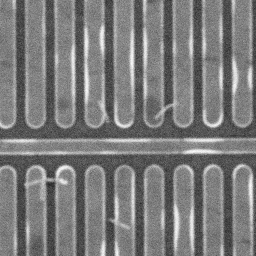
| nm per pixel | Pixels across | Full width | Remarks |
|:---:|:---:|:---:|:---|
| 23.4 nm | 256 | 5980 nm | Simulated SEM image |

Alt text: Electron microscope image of groups of lines, slits or small figures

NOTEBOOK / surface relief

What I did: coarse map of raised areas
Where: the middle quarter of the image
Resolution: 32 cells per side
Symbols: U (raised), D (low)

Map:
UUDDDDUUUUDDDUUUUDDDUUUUDDDDUUUU
UUDDDDUUUUDDDUUUUDDDUUUUDDDDUUUU
UUDDDDUUUUDDDUUUUDDDUUUUDDDDUUUU
UUDDDDUUUUDDDUUUUDDDUUUUDDDDUUUU
UUDDDDUUUUDDDUUUUDDDUUUUDDDDUUUU
UUDDDDUUUUDDDUUUUDDDUUUUDDDDUUUU
UUDDDDUUUUDDDUUUUDDDUUUUDDDDUUUU
UUDDDDUUUUDDDUUUUDDDUUUUUDDDUUUU
UUUDDDUUUUDDDUUUUDDDUUUUUDDDUUUU
UUUDDUUUUUDDDUUUUDDDUUUUUDDDUUUU
UUUDDUUUUUDDDUUUUDDDUUUUUDDUUUUU
UUUDDUUUUUDDDUUUUDDDUUUUUDDDUUUU
UUUDDUUUUUDDDUUUUDDDUUUUUDDDUUUU
UUUDDUUUUUDDDUUUUDDDUUUUUDDDUUUU
UUDDDDUUUUDDDUUUUDDDUUUUDDDDUUUU
UUDDDDDUUDDDDDUUDDDDDUUUDDDDDUUD
DDDDDDDDDDDDDDDDDDDDDDDDDDDDDDDD
DDDDDDDDDDDDDDDDDDDDDDDDDDDDDDDD
DDDDDDDDDDDDDDDDDDDDDDDDDDDDDDDD
UUUUUUUUUUUUUUUUUUUUUUUUUUUUUUUU
UUUUUUUUUUUUUUUUUUUUUUUUUUUUUUUU
UUUUUUUUUUUUUUUUUUUUUUUUUUUUUUUU
DDDDDDDDDDDDDDDDDDDDDDDDDDDDDDDD
DDDDDDDDDDDDDDDDDDDDDDDDDDDDDDDD
DDDDDDDDDDDDDDDDDDDDDDDDDDDDDDDD
DDDDDDDUUDDDDDUUDDDDDDUDDDDDDUUD
UUDDDDUUUUDDDUUUUDDDDUUUDDDDUUUU
UUUDDDUUUUDDDUUUUDDDUUUUUDDDUUUU
UUUDDDUUUUDDDUUUUDDDUUUUUDDDUUUU
UUUDDDUUUUDDDUUUUDDDUUUUUDDDUUUU
UUUDDDUUUUDDDUUUUDDDUUUUUDDDUUUU
UUUDDDUUUUDDDUUUUDDDUUUUUDDDUUUU